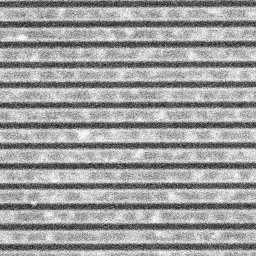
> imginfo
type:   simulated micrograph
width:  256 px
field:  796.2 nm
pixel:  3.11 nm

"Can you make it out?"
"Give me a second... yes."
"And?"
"parallel lines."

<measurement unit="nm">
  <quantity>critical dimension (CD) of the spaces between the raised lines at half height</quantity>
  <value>24.9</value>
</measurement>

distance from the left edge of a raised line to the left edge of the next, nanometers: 62.9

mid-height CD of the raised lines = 0.0389 um